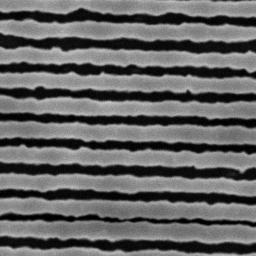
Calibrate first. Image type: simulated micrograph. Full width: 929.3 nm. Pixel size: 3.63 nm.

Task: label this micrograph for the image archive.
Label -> parallel lines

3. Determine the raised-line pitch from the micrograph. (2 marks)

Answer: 90.7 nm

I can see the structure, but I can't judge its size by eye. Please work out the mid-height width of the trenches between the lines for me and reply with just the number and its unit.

0.0345 µm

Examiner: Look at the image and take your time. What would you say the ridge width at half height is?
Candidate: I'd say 58.5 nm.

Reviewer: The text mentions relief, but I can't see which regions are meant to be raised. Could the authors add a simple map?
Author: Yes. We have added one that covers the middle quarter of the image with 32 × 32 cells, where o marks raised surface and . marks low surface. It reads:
..............oo...ooo..oooo.o..
................................
ooo......o......................
oooooooooooooooooooooooooooooooo
oooooooooooooooooooooooooooooooo
oooooooooooooooooooooooooooooooo
..o......o...ooooooooooooooooooo
................................
oo..............................
oooooooooooo...oooooo....ooooo.o
oooooooooooooooooooooooooooooooo
oooooooooooooooooooooooooooooooo
oooooooooooooooooooooooooooooooo
................................
..o.............................
ooooooooooooooooooo..oooo.oooooo
oooooooooooooooooooooooooooooooo
oooooooooooooooooooooooooooooooo
..oooooooooooooooooooooooooooooo
.........................ooo.ooo
................................
oo.oooooo...oooo....oo..........
oooooooooooooooooooooooooooooooo
oooooooooooooooooooooooooooooooo
oooooooooooooooooooooooooooooooo
.........oo.........oo...ooooooo
................................
..o.............................
ooooooooooooooooooooooooo.oooo..
oooooooooooooooooooooooooooooooo
oooooooooooooooooooooooooooooooo
...o...ooooooooooooooooooooooooo